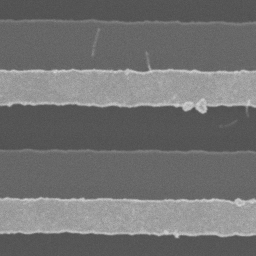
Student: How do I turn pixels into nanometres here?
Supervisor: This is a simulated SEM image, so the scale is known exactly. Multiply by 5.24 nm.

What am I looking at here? lines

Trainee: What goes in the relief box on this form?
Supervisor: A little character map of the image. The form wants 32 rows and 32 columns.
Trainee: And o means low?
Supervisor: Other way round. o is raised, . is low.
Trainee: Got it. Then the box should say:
................................
................................
................................
oooooooooooooooooooooooooooooooo
oooooooooooooooooooooooooooooooo
oooooooooooooooooooooooooooooooo
oooooooooooooooooooooooooooooooo
oooooooooooooooooooooooooooooooo
oooooooooooooooooooooooooooooooo
oooooooooooooooooooooooooooooooo
oooooooooooooooooooooooooooooooo
oooooooooooooooooooooooooooooooo
oooooooooooooooooooooooooooooooo
.......................ooo......
................................
................................
................................
................................
................................
oooooooooooooooooooooooooooooooo
oooooooooooooooooooooooooooooooo
oooooooooooooooooooooooooooooooo
oooooooooooooooooooooooooooooooo
oooooooooooooooooooooooooooooooo
oooooooooooooooooooooooooooooooo
oooooooooooooooooooooooooooooooo
oooooooooooooooooooooooooooooooo
oooooooooooooooooooooooooooooooo
oooooooooooooooooooooooooooooooo
......................o....oo...
................................
................................